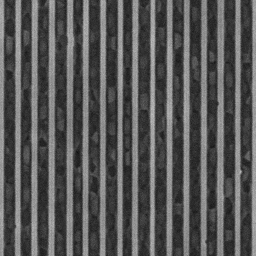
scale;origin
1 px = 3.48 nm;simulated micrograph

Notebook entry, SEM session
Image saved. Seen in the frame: parallel lines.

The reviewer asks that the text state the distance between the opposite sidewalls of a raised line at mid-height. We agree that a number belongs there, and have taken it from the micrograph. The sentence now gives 19.1 nm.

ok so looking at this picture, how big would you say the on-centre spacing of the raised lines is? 58.8 nanometers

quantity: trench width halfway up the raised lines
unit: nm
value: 41.3